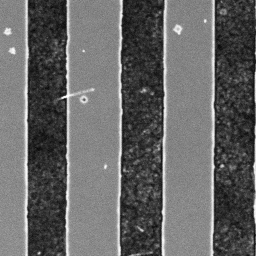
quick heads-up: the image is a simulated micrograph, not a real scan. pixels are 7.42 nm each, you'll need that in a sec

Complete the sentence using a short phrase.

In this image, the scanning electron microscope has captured lines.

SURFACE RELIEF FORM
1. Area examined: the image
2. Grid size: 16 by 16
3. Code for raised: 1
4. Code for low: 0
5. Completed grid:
1100111100111000
1100111100111000
1100111100111000
1100111100111000
1100111100111000
1100111100111000
1100111100111000
1100111100111000
1100111100111000
1100111100111000
1100111100111000
1100111100111000
1100111100111000
1100111000111000
1100111000111000
1100111100111000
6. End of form